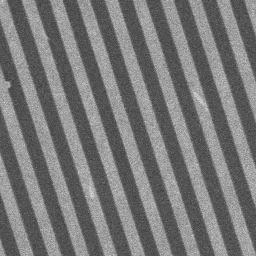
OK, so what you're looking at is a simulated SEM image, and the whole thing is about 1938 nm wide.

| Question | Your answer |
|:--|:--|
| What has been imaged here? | parallel lines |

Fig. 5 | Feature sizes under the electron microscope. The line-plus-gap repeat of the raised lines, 200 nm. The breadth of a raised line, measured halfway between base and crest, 13.5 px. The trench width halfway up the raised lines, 102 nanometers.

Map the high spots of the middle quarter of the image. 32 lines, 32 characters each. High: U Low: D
DDUUUDDDUUUUDDDUUUUDDDUUUUDDDUUU
DDUUUDDDDUUUDDDDUUUDDDDUUUDDDDUU
DDUUUUDDDUUUUDDDUUUDDDDUUUUDDDUU
DDDUUUDDDUUUUDDDUUUUDDDUUUUDDDUU
DDDUUUDDDDUUUDDDDUUUDDDDUUUDDDDU
DDDUUUUDDDUUUDDDDUUUDDDDUUUDDDDU
DDDDUUUDDDUUUUDDDUUUUDDDUUUUDDDU
DDDDUUUDDDDUUUDDDDUUUDDDDUUUDDDD
UDDDUUUDDDDUUUDDDDUUUDDDDUUUUDDD
UDDDDUUUDDDUUUUDDDUUUUDDDUUUUDDD
UDDDDUUUDDDDUUUDDDDUUUDDDDUUUDDD
UUDDDUUUDDDDUUUDDDDUUUDDDDUUUDDD
UUDDDUUUUDDDUUUUDDDUUUUDDDUUUUDD
UUDDDDUUUDDDDUUUDDDDUUUDDDDUUUDD
UUUDDDUUUUDDDUUUDDDDUUUDDDDUUUDD
UUUDDDUUUUDDDUUUUDDDUUUUDDDUUUUD
UUUDDDDUUUDDDDUUUDDDDUUUDDDDUUUD
UUUUDDDUUUUDDDUUUDDDDUUUDDDDUUUD
UUUUDDDUUUUDDDUUUUDDDUUUUDDDUUUU
DUUUDDDDUUUDDDDUUUDDDDUUUDDDDUUU
DUUUUDDDUUUUDDDUUUDDDDUUUDDDDUUU
DUUUUDDDUUUUDDDUUUUDDDUUUUDDDUUU
DDUUUDDDDUUUDDDDUUUDDDUUUUDDDDUU
DDUUUDDDDUUUDDDDUUUDDDDUUUDDDDUU
DDUUUUDDDUUUUDDDUUUUDDDUUUUDDDUU
DDDUUUDDDDUUUDDDDUUUDDDUUUUDDDUU
DDDUUUDDDDUUUDDDDUUUDDDDUUUDDDDU
DDDUUUUDDDUUUUDDDUUUUDDDUUUUDDDU
DDDDUUUDDDDUUUDDDDUUUDDDUUUUDDDU
UDDDUUUDDDDUUUDDDDUUUDDDDUUUDDDD
UDDDUUUUDDDUUUUDDDUUUUDDDUUUUDDD
UDDDDUUUDDDDUUUDDDUUUUDDDDUUUDDD